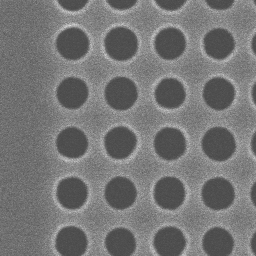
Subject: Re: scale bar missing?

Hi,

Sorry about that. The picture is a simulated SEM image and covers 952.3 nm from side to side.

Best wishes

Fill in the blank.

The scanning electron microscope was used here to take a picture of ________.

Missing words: a regular array of holes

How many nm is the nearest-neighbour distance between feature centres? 181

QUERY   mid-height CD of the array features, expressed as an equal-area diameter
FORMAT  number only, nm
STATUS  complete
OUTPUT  121